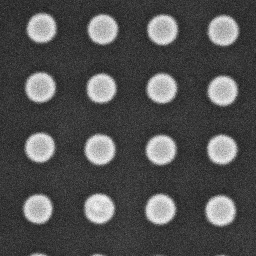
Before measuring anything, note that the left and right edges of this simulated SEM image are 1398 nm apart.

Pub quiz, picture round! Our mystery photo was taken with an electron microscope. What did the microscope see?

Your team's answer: a regular array of raised bodies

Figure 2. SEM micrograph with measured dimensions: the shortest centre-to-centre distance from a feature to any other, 324 nm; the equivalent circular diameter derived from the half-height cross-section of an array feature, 152 nm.